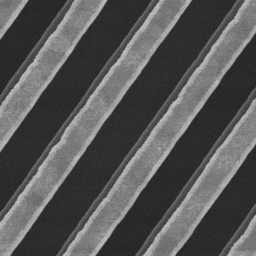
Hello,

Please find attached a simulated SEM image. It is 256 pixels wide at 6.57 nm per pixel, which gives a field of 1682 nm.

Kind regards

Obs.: lines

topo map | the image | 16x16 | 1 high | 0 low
1000110001110011
1001110011100011
0011100011000111
0011000110001110
0111001110001100
1110001100011000
1100011000111001
1000111000110001
1001110001100011
0001100011100111
0011100111001110
0111000110001100
0110001100011000
1100011100111001
1100011001110001
1000110001100011